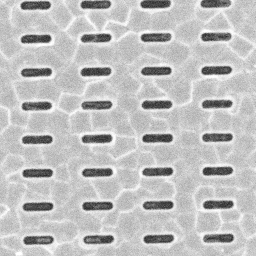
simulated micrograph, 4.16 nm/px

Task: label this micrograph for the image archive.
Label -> a regular array of holes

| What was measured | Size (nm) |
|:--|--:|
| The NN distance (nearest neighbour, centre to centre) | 139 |